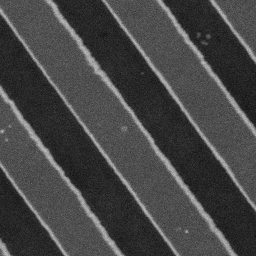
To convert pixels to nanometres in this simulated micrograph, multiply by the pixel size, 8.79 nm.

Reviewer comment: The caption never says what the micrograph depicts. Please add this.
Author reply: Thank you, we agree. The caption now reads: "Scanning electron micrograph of lines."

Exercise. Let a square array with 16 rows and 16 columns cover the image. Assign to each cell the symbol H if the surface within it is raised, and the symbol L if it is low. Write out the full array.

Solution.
HHHHLLLHHHLLLHHH
LHHHLLLHHHHLLLHH
LHHHHLLLHHHHLLLH
LLHHHHLLLHHHHLLL
LLLHHHLLLLHHHLLL
LLLHHHHLLLHHHHLL
HLLLHHHHLLLHHHHL
HHLLLHHHHLLLHHHH
HHLLLLHHHLLLLHHH
HHHLLLHHHHLLLHHH
HHHHLLLHHHHLLLHH
LHHHHLLLHHHHLLLH
LLHHHLLLHHHHLLLH
LLHHHHLLLHHHHLLL
LLLHHHHLLLHHHHLL
LLLLHHHLLLLHHHLL